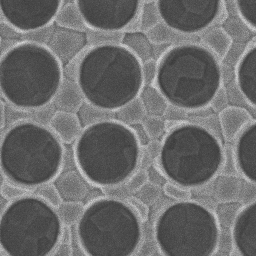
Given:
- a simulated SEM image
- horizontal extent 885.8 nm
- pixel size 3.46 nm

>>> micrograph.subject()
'holes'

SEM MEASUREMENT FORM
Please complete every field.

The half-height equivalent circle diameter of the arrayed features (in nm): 212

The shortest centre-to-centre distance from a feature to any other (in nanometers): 268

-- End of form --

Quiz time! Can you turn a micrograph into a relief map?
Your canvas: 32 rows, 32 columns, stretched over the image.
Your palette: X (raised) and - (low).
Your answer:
-------XXX-------XXX-------XXX--
-------XXX-------XXX-------XXX--
X-----XXXXX-----XXXXX------XXXX-
XX---XXXXXXXX--XXXXXXX---XXXXXXX
XXXXXXXXXXXXXXXXXXXXXXXXXXXXXXXX
XXXXXXXXXXXXXXXXXXXXXXXXXXXXXXXX
X-----XXXXX-----XXXXX-----XXXXX-
-------XXXX------XXXX------XXX--
-------XXX--------XX-------XXX--
-------XXX--------XX-------XXX--
-------XXX--------XX-------XXX--
-------XXXX------XXX-------XXX--
X-----XXXXX-----XXXXX-----XXXXX-
XXXXXXXXXXXXX-XXXXXXXXXXXXXXXXXX
XXXXXXXXXXXXXXXXXXXXXXXXXXXXXXXX
XXX-XXXXXXXX---XXXXXXXXXXXXXXXXX
X-----XXXXX-----XXXXXX----XXXXX-
X------XXX-------XXXX------XXX--
--------XX-------XXX-------XXX--
--------XX-------XXX--------XX--
-------XXX-------XXX-------XXX--
X------XXXX-----XXXXX------XXX--
XX----XXXXXX---XXXXXXX----XXXXXX
XXXXXXXXXXXXXXXXXXXXXXXXXXXXXXXX
XXXXXXXXXXXXXXXXXXXXXXXXXXXXXXXX
XX----XXXXXX---XXXXXXX--XXXXXXXX
X------XXXX-----XXXXX-----XXXX--
-------XXX-------XXX-------XXX--
-------XXX-------XXX-------XX---
-------XXX-------XXX-------XX---
-------XXX-------XXX-------XXX--
X-----XXXXX-----XXXXX-----XXXX--